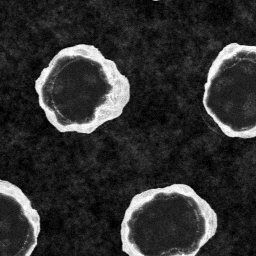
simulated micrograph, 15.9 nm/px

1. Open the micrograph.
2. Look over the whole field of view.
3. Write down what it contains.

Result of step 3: raised bodies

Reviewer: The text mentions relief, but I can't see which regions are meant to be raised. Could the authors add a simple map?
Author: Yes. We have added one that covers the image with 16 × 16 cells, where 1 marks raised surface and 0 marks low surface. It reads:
0000000000000000
0000000000000000
0000000000000000
0000110000000011
0001111000000111
0011111100000111
0001111000000111
0001110000000011
0000000000000000
0000000000000000
0000000000000000
0000000000000000
1000000001111000
1100000011111000
1100000011111000
1100000011110000